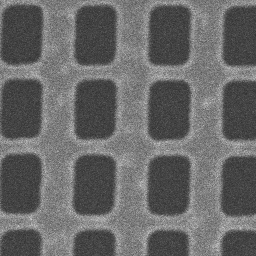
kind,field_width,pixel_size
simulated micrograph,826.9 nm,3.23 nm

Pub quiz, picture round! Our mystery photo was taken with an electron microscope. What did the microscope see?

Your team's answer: holes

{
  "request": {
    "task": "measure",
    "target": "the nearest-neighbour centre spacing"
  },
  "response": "239 nanometres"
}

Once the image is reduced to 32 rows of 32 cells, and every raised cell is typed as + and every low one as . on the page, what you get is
++++++++++++++++++++++++++++++++
.....+++++.....++++.....++++....
......+++......++++.....++++....
.....++++......+++......++++....
.....++++......+++......++++....
.....++++......+++......++++....
.....++++......+++......++++....
.....++++.....+++++.....++++....
++++++++++++++++++++++++++++++++
++++++++++++++++++++++++++++++++
.....+++++....+++++.....++++....
.....++++......+++......++++....
.....++++......+++......++++....
.....++++......+++......++++....
.....++++......+++......++++....
.....++++......+++......++++....
.....++++.....++++......++++....
+.++++++++...++++++....++++++...
++++++++++++++++++++++++++++++++
+....+++++....++++++...++++++...
.....++++.....+++++.....++++....
.....++++......+++......++++....
.....++++......+++......++++....
.....++++......+++......++++....
.....++++.....++++......++++....
.....++++.....++++......+++.....
....+++++.....+++++....+++++....
++++++++++++++++++++++++++++++++
++++++++++++++++++++++++++++++++
.....++++.....+++++.....++++....
.....++++......+++......++++....
.....++++.....++++......++++....